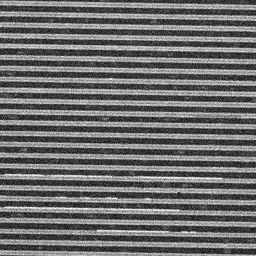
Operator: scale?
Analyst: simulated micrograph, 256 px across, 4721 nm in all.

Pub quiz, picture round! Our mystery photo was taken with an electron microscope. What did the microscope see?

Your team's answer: parallel lines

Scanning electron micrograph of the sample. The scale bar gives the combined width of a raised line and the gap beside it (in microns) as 0.2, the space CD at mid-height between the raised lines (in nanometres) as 134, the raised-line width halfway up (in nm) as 66.8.